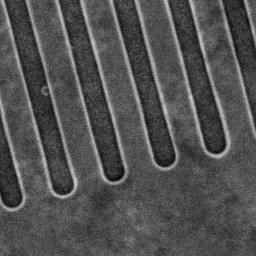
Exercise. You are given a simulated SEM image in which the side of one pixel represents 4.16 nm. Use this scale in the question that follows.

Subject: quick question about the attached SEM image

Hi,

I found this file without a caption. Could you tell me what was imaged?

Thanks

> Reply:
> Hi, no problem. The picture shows parallel lines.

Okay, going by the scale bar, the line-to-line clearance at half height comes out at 92.5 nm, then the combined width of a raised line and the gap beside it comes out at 220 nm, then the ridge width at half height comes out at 127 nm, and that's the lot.